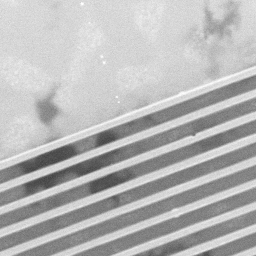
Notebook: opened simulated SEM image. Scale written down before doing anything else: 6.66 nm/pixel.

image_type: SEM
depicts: parallel lines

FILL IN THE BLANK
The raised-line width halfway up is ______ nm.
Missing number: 47.6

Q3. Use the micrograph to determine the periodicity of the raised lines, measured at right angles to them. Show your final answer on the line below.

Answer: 141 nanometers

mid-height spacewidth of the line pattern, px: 13.3